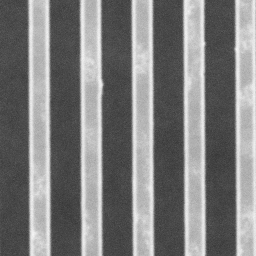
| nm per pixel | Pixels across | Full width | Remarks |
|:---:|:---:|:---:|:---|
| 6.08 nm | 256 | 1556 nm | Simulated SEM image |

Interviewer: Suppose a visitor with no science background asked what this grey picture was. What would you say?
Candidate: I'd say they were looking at parallel lines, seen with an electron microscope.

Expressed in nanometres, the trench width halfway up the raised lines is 210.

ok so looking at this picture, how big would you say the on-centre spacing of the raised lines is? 51.7 pixels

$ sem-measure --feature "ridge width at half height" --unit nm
106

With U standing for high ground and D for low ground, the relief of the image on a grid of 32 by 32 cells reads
DDDDUUDDDDUUDDDDDUUDDDDUUDDDDDUU
DDDDUUDDDDUUDDDDDUUDDDDUUDDDDDUU
DDDDUUDDDDUUDDDDDUUDDDDUUDDDDDUU
DDDDUUDDDDUUDDDDDUUDDDDUUDDDDDUU
DDDDUUDDDDUUDDDDDUUDDDDUUDDDDDUU
DDDDUUDDDDUUDDDDDUUDDDDUUDDDDDUU
DDDDUUDDDDUUDDDDDUUDDDDUUDDDDDUU
DDDDUUDDDDUUDDDDDUUDDDDUUDDDDDUU
DDDDUUDDDDUUDDDDDUUDDDDUUDDDDDUU
DDDDUUDDDDUUDDDDDUUDDDDUUDDDDDUU
DDDDUUDDDDUUUDDDDUUDDDDUUDDDDDUU
DDDDUUDDDDUUDDDDDUUDDDDUUDDDDDUU
DDDDUUDDDDUUDDDDDUUDDDDUUDDDDDUU
DDDDUUDDDDUUDDDDDUUDDDDUUDDDDDUU
DDDDUUDDDDUUDDDDDUUDDDDUUDDDDDUU
DDDDUUDDDDUUUDDDDUUDDDDUUDDDDDUU
DDDDUUDDDDUUUDDDDUUDDDDUUDDDDDUU
DDDDUUDDDDUUUDDDDUUDDDDUUDDDDDUU
DDDDUUDDDDUUDDDDDUUDDDDUUDDDDDUU
DDDDUUDDDDUUUDDDDUUDDDDUUDDDDDUU
DDDDUUDDDDUUUDDDDUUDDDDUUDDDDDUU
DDDDUUDDDDUUDDDDDUUDDDDUUDDDDDUU
DDDDUUDDDDUUUDDDDUUDDDDUUDDDDDUU
DDDDUUDDDDUUUDDDDUUDDDDUUDDDDDUU
DDDDUUDDDDUUDDDDDUUDDDDUUDDDDDUU
DDDDUUDDDDUUDDDDDUUDDDDUUDDDDDUU
DDDDUUDDDDUUDDDDDUUDDDDUUDDDDDUU
DDDDUUDDDDUUDDDDDUUDDDDUUDDDDDUU
DDDDUUDDDDUUDDDDDUUDDDDUUDDDDDUU
DDDDUUDDDDUUDDDDDUUDDDDUUDDDDDUU
DDDDUUDDDDUUUDDDDUUDDDDUUDDDDDUU
DDDDUUDDDDUUDDDDDUUDDDDUUDDDDDUU